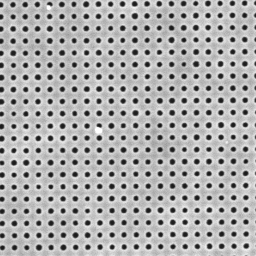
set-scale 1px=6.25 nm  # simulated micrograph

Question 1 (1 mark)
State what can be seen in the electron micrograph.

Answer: a regular array of holes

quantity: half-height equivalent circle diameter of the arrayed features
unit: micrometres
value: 0.0353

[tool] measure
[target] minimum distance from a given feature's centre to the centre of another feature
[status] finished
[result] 74.5 nanometres